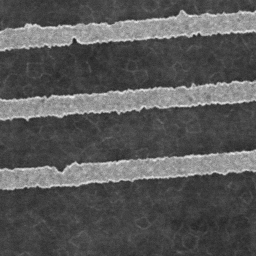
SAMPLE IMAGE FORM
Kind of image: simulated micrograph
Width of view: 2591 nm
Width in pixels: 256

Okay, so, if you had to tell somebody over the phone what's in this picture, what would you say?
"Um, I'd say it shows one or a few lines or trenches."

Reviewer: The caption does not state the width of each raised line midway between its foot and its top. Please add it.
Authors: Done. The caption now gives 0.202 microns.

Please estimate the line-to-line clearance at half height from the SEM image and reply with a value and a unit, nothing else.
497 nm